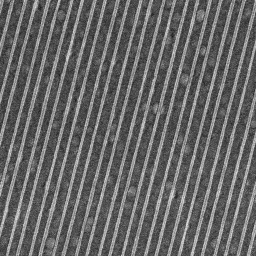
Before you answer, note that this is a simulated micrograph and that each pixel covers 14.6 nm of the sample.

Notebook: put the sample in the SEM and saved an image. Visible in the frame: parallel lines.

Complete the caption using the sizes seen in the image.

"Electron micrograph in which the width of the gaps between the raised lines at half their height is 122 nanometers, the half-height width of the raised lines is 35.5 nanometers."